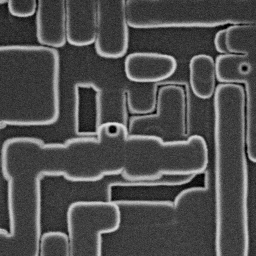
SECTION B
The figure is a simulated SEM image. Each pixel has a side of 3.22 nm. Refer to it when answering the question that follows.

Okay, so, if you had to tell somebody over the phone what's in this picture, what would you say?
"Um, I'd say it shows wiring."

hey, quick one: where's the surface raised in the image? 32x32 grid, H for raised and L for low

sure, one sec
LHHHHHHHHHHHHHHHHHHHHHHHHHHHHHHH
LHHHHHHHHHHHHHHHHHHHHHHHHHHHHHHH
LLLLLHHHHHHHHHHHHHHHHHHHHHHHHHHH
LLLLLHHHHHHHHHHHLLLLLLLLLLLLLHHH
LLLLLHHHHHHHHHHHLLLLLLLLLLLHHHHH
LLLLLHHHLHHLHHHHLLLLLLLLLLLHHHHH
HHHHHHHLLLLLHHHHLLLLLLLLLLLLHHHH
HHHHHHHLLLLLLLLLHHHHHHLLHHLHHHHH
HHHHHHHLLLLLLLLLHHHHHHLLHHHHHHHH
HHHHHHHLLLLLLLLLHHHHHLLLHHHHHHHH
HHHHHHHLLLLLLLLLLLLLLLLLLLLHHHHH
HHHHHHHLLLLLLLLLLLLLLLLLLLLHHHHH
HHHHHHHLLLLLLLLLLLLLLLLLLLLHHHHH
HHHHHHHLLLLLLLLLLLLLLLLLLLLHHHHH
HHHHHHHLLLLLLLLLLLLLLLLLLLLHHHHH
HLLLLLLLLLLLLLLLLLLLLLLLLLLHHHHH
LLLLLLLLLLLLHHHHLLLLLLLLLLLHHHHH
LHHHHLLLLHHHHHHHHHHHLLLLHLLHHHHH
HHHHHHHHHHHHHHHHHHHHHHHHHHLHHHHH
HHHHHHHHHHHHHHHHHHHHHHHHHHLHHHHH
HHHHHHHHHHHHHHHHHHHHHHHHHHLHHHHL
LHHHHHHHHHHHHHHHHHHHHHHHLLLHHHHL
LHHHHLLLLHLLLLLLLLLLLLLLLLLHHHHL
LHHHHLLLLLLLLLLLLLLLLLLLLLLHHHHL
LHHHHLLLLLLLLLLLLLLLLLLLLLLHHHHL
LHHHHLLLLHHHHHLLLLLLLLLLLLLHHHHL
LHHHHLLLLHHHHHHLLLLLLLLLLLLHHHHL
LHHHHLLLLHHHHHHLLLLLLLLLLLLHHHHL
LHHHHLLLLHHHHHHLLLLLLLLLLLLHHHHL
HHHHHLHHHHHHHLLLLLLLLLLLLLLHHHHL
HHHHHHHHHHHHLLLLLLLLLLLLLLLHHHHL
HHHHHHHHHHHHLLLLLLLLLLLLLLLHHHHL